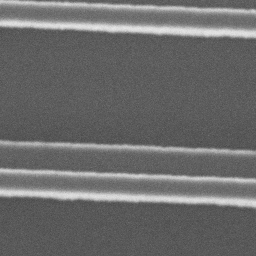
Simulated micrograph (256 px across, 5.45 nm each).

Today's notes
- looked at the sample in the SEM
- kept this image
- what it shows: lines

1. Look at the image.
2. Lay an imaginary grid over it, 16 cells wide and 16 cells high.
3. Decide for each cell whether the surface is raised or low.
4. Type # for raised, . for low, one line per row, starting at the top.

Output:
################
..##############
................
................
................
................
................
................
................
################
################
################
.............###
................
................
................